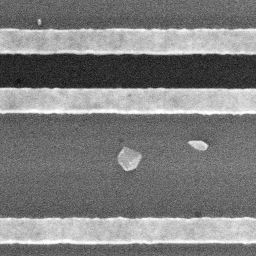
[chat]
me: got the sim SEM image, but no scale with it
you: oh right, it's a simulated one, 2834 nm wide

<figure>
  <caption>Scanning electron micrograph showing lines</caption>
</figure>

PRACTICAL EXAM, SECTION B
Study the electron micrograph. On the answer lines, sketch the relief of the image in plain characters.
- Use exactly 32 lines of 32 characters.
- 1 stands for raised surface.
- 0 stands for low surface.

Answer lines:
00000000000000000000000000000000
00000000000000000000000000000000
00000000000000000000000000000000
00000000000000000000000000000000
11111111111111111111111111111111
11111111111111111111111111111111
11111111111111111111111111111111
00000000000000000000000000000000
00000000000000000000000000000000
00000000000000000000000000000000
00000000000000000000000000000000
11111111111111111111111111111111
11111111111111111111111111111111
11111111111111111111111111111111
00000000000000000000000000000000
00000000000000000000000000000000
00000000000000000000000000000000
00000000000000000000000000000000
00000000000000000000000000000000
00000000000000000000000000000000
00000000000000000000000000000000
00000000000000000000000000000000
00000000000000000000000000000000
00000000000000000000000000000000
00000000000000000000000000000000
00000000000000000000000000000000
00000000000000000000000000000000
11111111111111111111111111111111
11111111111111111111111111111111
11111111111111111111111111111111
00000000000000000000000000000000
00000000000000000000000000000000